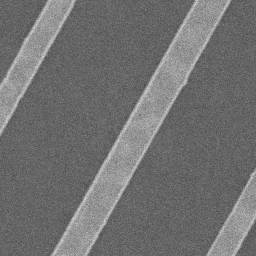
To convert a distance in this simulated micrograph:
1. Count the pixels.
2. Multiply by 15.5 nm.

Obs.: one or a few lines or trenches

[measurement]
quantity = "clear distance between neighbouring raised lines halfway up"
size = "1650 nm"